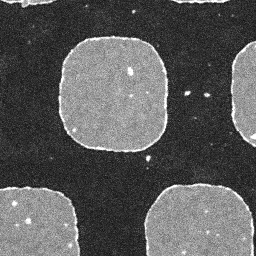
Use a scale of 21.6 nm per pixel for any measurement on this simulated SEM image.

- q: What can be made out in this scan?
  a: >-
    raised bodies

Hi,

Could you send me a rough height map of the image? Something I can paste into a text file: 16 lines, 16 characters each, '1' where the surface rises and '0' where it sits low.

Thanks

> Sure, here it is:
0000000000000000
0000000000000000
0000011110000000
0000111111000001
0000111111000001
0000111111000001
0000111111000001
0000111111000001
0000111111000001
0000000000000000
0000000000000000
0000000000000000
1111000000111110
1111100001111111
1111100001111111
1111100001111111